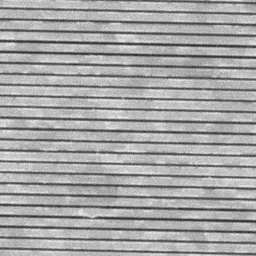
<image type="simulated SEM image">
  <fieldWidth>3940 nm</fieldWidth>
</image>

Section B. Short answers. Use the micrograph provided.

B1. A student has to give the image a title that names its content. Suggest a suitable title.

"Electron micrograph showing parallel lines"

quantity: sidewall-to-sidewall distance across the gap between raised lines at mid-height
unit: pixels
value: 3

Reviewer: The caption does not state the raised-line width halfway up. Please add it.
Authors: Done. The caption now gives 0.121 micrometres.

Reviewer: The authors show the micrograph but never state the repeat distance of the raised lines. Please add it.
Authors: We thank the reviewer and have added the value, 10.9 px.